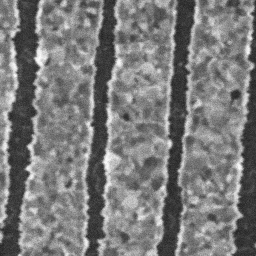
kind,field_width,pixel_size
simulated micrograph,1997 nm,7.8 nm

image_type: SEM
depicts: one or a few lines or trenches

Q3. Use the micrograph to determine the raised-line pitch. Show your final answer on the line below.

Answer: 594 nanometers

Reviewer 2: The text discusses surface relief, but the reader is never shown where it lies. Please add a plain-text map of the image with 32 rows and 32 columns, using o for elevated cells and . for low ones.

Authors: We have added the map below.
oo...oooooooo..ooooooo...ooooooo
oo...oooooooo..ooooooo...oooooo.
oo...oooooooo..ooooooo..ooooooo.
oo...ooooooo...ooooooo..ooooooo.
oo...ooooooo...ooooooo..ooooooo.
o....ooooooo..oooooooo..ooooooo.
oo...ooooooo...ooooooo..ooooooo.
oo...ooooooo...oooooo...ooooooo.
oo...ooooooo..ooooooo...ooooooo.
oo...ooooooo..ooooooo...ooooooo.
oo...ooooooo..ooooooo...ooooooo.
oo...ooooooo..ooooooo...ooooooo.
o...ooooooo...ooooooo...ooooooo.
o....oooooo...ooooooo...ooooooo.
o....oooooo...ooooooo...ooooooo.
o...ooooooo...ooooooo..ooooooo..
o...ooooooo...ooooooo..ooooooo..
o...ooooooo...ooooooo..ooooooo..
o...ooooooo..oooooooo..ooooooo..
o...ooooooo..oooooooo..ooooooo..
o...ooooooo..oooooooo..ooooooo..
o...ooooooo..oooooooo.oooooooo..
o...oooooo....ooooooo.oooooooo..
o..oooooooo..oooooooo..ooooooo..
o..oooooooo..oooooooo..ooooooo..
o..oooooooo..ooooooo...ooooooo..
...oooooooo..ooooooo...ooooooo..
...oooooooo..ooooooo...oooooo...
...oooooooo..ooooooo...oooooo...
...oooooooo..ooooooo...oooooo...
...oooooooo..ooooooo..ooooooo...
...ooooooo...oooooo...ooooooo...